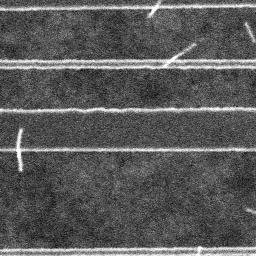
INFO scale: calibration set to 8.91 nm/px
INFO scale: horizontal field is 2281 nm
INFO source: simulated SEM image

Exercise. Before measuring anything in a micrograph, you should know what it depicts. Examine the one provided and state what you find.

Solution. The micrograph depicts lines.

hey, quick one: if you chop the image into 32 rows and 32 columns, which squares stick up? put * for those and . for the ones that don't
********************************
................................
................................
................................
................................
................................
................................
.....................*..........
**.*.**.......*.................
................................
................................
................................
................................
................................
********************************
********************************
********************************
********************************
********************************
................................
................................
................................
................................
................................
................................
................................
................................
................................
................................
................................
................................
********************************